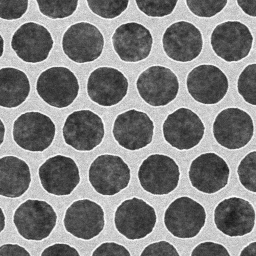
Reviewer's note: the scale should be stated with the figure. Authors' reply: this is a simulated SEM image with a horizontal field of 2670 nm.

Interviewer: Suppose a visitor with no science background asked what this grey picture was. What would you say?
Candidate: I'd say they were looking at a regular array of holes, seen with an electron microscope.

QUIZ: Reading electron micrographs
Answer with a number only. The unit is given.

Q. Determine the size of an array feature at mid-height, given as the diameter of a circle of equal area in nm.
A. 427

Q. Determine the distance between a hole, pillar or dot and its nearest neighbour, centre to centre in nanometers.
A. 516